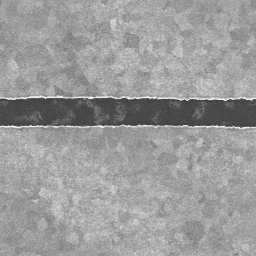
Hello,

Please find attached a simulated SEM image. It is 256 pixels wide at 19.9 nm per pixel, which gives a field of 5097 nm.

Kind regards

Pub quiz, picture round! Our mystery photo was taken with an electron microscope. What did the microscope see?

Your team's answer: one or a few lines or trenches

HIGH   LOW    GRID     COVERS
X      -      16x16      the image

XXXXXXXXXXXXXXXX
XXXXXXXXXXXXXXXX
XXXXXXXXXXXXXXXX
XXXXXXXXXXXXXXXX
XXXXXXXXXXXXXXXX
XXXXXXXXXXXXXXXX
----------------
----------------
XXXXXXXXXXXXXXXX
XXXXXXXXXXXXXXXX
XXXXXXXXXXXXXXXX
XXXXXXXXXXXXXXXX
XXXXXXXXXXXXXXXX
XXXXXXXXXXXXXXXX
XXXXXXXXXXXXXXXX
XXXXXXXXXXXXXXXX